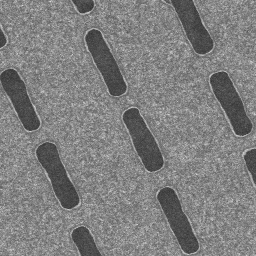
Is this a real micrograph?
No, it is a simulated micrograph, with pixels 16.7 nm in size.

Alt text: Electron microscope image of holes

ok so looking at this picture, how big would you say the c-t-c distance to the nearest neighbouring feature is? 1450 nm